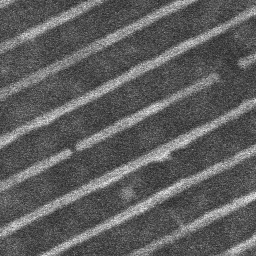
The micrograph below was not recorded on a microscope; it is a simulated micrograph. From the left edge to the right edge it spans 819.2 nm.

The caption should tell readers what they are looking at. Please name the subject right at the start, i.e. parallel lines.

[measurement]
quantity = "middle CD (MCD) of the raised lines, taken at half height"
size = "23.3 nm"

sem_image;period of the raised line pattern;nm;131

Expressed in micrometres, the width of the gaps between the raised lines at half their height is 0.108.